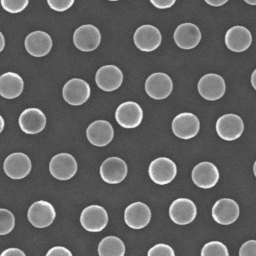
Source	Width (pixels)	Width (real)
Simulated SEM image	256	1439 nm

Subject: a regular array of raised bodies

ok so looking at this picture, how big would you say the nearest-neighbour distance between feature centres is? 245 nm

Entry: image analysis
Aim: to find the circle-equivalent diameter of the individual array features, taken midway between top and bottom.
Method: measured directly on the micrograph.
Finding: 150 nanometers